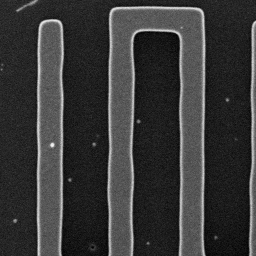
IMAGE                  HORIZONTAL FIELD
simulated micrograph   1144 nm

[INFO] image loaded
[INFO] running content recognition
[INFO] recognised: groups of lines, slits or small figures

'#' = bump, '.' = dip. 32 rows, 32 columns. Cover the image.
................................
..............###########.......
..............###########.......
.....###......###########.......
.....###......###.....####......
.....###......###......###......
.....###......###......###......
.....###......###......###......
.....###......###......###......
.....###......###......###......
.....###......###......###.....#
.....###......###......##......#
.....###......###......##......#
.....###......###.....###.......
.....###......###.....###.......
.....###......###......##.......
.....###......###......##.......
.....###......##.......##.......
.....###......##.......##.......
.....###......##.......##.......
.....###......###......##.......
.....###......###......##......#
.....###......###......##......#
.....###......###......##......#
.....###......###......##......#
.....###......##.......##......#
.....###......##.......##......#
.....###......##.......##......#
.....###......##.......##......#
.....###......###......##......#
.....###......###......##......#
.....###......###.....####.....#